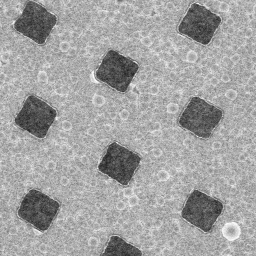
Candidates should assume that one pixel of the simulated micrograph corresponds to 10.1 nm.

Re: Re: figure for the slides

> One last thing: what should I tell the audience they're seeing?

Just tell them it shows raised bodies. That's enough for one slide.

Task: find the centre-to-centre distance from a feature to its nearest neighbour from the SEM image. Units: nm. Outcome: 936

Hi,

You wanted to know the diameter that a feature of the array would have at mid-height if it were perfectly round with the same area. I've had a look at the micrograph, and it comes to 38.9 pixels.